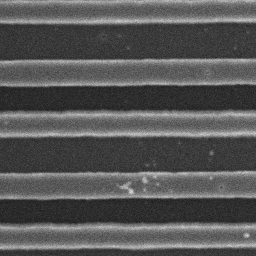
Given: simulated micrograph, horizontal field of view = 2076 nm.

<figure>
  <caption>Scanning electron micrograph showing lines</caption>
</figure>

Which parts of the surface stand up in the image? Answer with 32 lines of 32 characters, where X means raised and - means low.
XXXXXXXXXXXXXXXXXXXXXXXXXXXXXXXX
XXXXXXXXXXXXXXXXXXXXXXXXXXXXXXXX
XXXXXXXXXXXXXXXXXXXXXXXXXXXXXXXX
--------------------------------
--------------------------------
--------------------------------
--------------------------------
---------------------------XXXXX
XXXXXXXXXXXXXXXXXXXXXXXXXXXXXXXX
XXXXXXXXXXXXXXXXXXXXXXXXXXXXXXXX
XXXXXXXXXXXXXXXXXXXXXXXXXXXX----
--------------------------------
--------------------------------
--------------------------------
XXXXXXXXXXXXXXXXXXXXXXXXXXXXXXXX
XXXXXXXXXXXXXXXXXXXXXXXXXXXXXXXX
XXXXXXXXXXXXXXXXXXXXXXXXXXXXXXXX
--------------------------------
--------------------------------
--------------------------------
--------------------------------
------------------------------XX
XXXXXXXXXXXXXXXXXXXXXXXXXXXXXXXX
XXXXXXXXXXXXXXXXXXXXXXXXXXXXXXXX
XXXXXXXXXXXXXXXXXXXXXXXXXXXXXXXX
--------------------------------
--------------------------------
--------------------------------
XXXXXXXXXXXXXXXXXXXXXXXXXXXXXXXX
XXXXXXXXXXXXXXXXXXXXXXXXXXXXXXXX
XXXXXXXXXXXXXXXXXXXXXXXXXXXXXXXX
--------------------------------